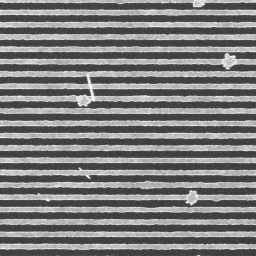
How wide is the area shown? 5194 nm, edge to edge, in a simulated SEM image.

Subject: parallel lines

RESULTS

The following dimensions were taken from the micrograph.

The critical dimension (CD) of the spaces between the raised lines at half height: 0.155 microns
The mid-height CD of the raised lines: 98.9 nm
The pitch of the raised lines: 250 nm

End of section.